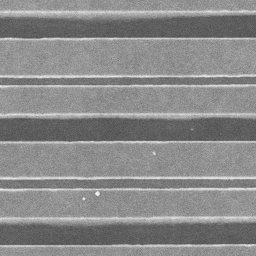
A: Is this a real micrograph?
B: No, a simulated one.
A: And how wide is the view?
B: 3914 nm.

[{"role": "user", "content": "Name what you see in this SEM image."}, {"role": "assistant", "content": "lines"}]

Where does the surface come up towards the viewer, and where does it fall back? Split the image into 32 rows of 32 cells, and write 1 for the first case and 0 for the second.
11111111111111111111111111111111
11111111111111111111111111100000
00000000000000000000000000000000
00000000000000000000000000000000
00000000000000000000000000000000
11111111111111111111111111111111
11111111111111111111111111111111
11111111111111111111111111111111
11111111111111111111111111111111
11111111111111111111111111111111
11111111111111111111111111111111
11111111111111111111111111111111
11111111111111111111111111111111
11111111111111111111111111111111
00000000000000000000000000000000
00000000000000000000000000000000
00000000000000000000000000000000
00000000000000000000000000000000
11111111111111111111111111111111
11111111111111111111111111111111
11111111111111111111111111111111
11111111111111111111111111111111
11111111111111111111111111111111
11111111111111111111111111111111
11111111111111111111111111111111
11111111111111111111111111111111
11111111111111111111111111111111
00000001000000000000000000000000
00000000000000000000000000000000
00000000000000000000000000000000
00000000000000000000000000000000
11111111111111111111111111111111